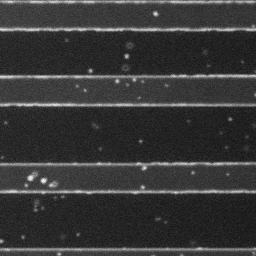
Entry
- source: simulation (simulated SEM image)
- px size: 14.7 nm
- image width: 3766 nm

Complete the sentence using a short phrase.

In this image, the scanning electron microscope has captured lines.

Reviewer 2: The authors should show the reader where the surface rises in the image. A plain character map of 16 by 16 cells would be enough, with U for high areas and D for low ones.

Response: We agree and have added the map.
UUUUUUUUUUUUUUUU
UUUUUUUUUUUUUUUU
DDDDDDDDDDDDDDDD
DDDDDDDDDDDDDDDD
DDDDDDDDDDDDDDDD
UUUUUUUUUUUUUUUU
UUUUUUUUUUUUUUUU
DDDDDDDDDDDDDDDD
DDDDDDDDDDDDDDDD
DDDDDDDDDDDDDDDD
UUUUUUUUUUUUUUUU
UUUUUUUUUUUUUUUU
DDDDDDDDDDDDDDDD
DDDDDDDDDDDDDDDD
DDDDDDDDDDDDDDDD
DDDDDDDDDDDDDDDD